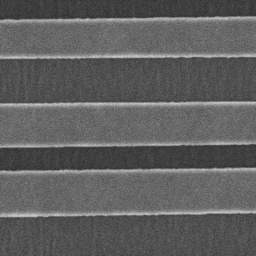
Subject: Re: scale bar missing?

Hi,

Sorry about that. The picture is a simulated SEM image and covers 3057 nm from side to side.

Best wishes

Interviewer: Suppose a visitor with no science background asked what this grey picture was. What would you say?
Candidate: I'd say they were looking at lines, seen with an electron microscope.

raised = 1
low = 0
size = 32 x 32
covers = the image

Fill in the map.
00000000000000000000000000000000
00000000000000000000000000000000
01111111111111111111111111111111
11111111111111111111111111111111
11111111111111111111111111111111
11111111111111111111111111111111
11111111111111111111111111111111
00000000000000000000000000000000
00000000000000000000000000000000
00000000000000000000000000000000
00000000000000000000000000000000
00000000000000000000000000000000
00000000000000000000000000000000
11111111111111111111111111111111
11111111111111111111111111111111
11111111111111111111111111111111
11111111111111111111111111111111
11111111111111111111111111111111
00000000000000000000000000000000
00000000000000000000000000000000
00000000000000000000000000000000
11111111111111111111111111111111
11111111111111111111111111111111
11111111111111111111111111111111
11111111111111111111111111111111
11111111111111111111111111111111
11111111111111111111111111111111
00000000000000000000000000000000
00000000000000000000000000000000
00000000000000000000000000000000
00000000000000000000000000000000
00000000000000000000000000000000